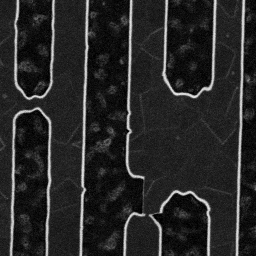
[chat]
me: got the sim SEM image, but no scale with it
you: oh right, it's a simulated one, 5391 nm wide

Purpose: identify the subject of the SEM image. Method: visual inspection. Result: one or a few lines or trenches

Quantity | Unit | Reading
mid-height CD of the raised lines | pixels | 34.1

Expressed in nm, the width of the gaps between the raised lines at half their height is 916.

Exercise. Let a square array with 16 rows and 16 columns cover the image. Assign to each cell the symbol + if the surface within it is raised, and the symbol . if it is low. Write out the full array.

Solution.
+..++...++...++.
+..++...++...++.
+..++...++...++.
+..++...++...++.
+..++...++...++.
+..++...+++..++.
+++++...+++++++.
+..++...+++++++.
+..++...+++++++.
+..++...+++++++.
+..++...+++++++.
+..++....++++++.
+..++....+...++.
+..++...++...++.
+..++...++...++.
+..++...++...++.